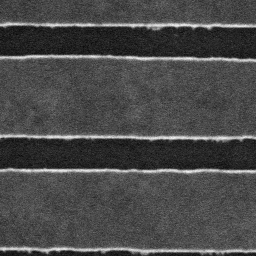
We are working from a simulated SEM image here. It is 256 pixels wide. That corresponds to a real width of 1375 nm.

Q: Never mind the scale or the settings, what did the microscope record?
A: lines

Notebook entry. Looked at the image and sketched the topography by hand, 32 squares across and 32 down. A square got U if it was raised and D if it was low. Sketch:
UUUUUUUUUUUUUUUUUUUUUUUUUUUUUUUU
UUUUUUUUUUUUUUUUUUUUUUUUUUUUUUUU
UUUUUUUUUUUUUUUUUUUUUUUUUUUUUUUU
DDDDDDDDDDDDDDDDDDDDDDDDDDDDDDDD
DDDDDDDDDDDDDDDDDDDDDDDDDDDDDDDD
DDDDDDDDDDDDDDDDDDDDDDDDDDDDDDDD
DDDDDDDDDDDDDDDDDDDDDDDDDDDDDDDD
UUUUUUUUUUUUUUUUUUUUUUUUUUUUUUUU
UUUUUUUUUUUUUUUUUUUUUUUUUUUUUUUU
UUUUUUUUUUUUUUUUUUUUUUUUUUUUUUUU
UUUUUUUUUUUUUUUUUUUUUUUUUUUUUUUU
UUUUUUUUUUUUUUUUUUUUUUUUUUUUUUUU
UUUUUUUUUUUUUUUUUUUUUUUUUUUUUUUU
UUUUUUUUUUUUUUUUUUUUUUUUUUUUUUUU
UUUUUUUUUUUUUUUUUUUUUUUUUUUUUUUU
UUUUUUUUUUUUUUUUUUUUUUUUUUUUUUUU
UUUUUUUUUUUUUUUUUUUUUUUUUUUUUUUU
DDDDDDDDDDDDDDDDDDDDDDDDDDDDDDDD
DDDDDDDDDDDDDDDDDDDDDDDDDDDDDDDD
DDDDDDDDDDDDDDDDDDDDDDDDDDDDDDDD
DDDDDDDDDDDDDDDDDDDDDDDDDDDDDDDD
UUUUUUUUUUUUUUUUUUUUUUUUUUUUUUUU
UUUUUUUUUUUUUUUUUUUUUUUUUUUUUUUU
UUUUUUUUUUUUUUUUUUUUUUUUUUUUUUUU
UUUUUUUUUUUUUUUUUUUUUUUUUUUUUUUU
UUUUUUUUUUUUUUUUUUUUUUUUUUUUUUUU
UUUUUUUUUUUUUUUUUUUUUUUUUUUUUUUU
UUUUUUUUUUUUUUUUUUUUUUUUUUUUUUUU
UUUUUUUUUUUUUUUUUUUUUUUUUUUUUUUU
UUUUUUUUUUUUUUUUUUUUUUUUUUUUUUUU
UUUUUUUUUUUUUUUUUUUUUUUUUUUUUUUU
DDDDDDDDDDDDDDDDDDDDDDDDDDDDDDDD